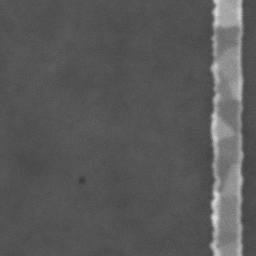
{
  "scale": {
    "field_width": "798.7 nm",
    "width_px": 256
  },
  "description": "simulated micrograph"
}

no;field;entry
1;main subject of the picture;one or a few lines or trenches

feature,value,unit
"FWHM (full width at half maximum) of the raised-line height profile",80.8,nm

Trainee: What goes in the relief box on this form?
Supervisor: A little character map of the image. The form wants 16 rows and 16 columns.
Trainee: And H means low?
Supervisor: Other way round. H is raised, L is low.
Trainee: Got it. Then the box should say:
LLLLLLLLLLLLLHHL
LLLLLLLLLLLLLHHL
LLLLLLLLLLLLLHHL
LLLLLLLLLLLLLHHL
LLLLLLLLLLLLLHHL
LLLLLLLLLLLLLHHL
LLLLLLLLLLLLLHHL
LLLLLLLLLLLLLHHL
LLLLLLLLLLLLLHHL
LLLLLLLLLLLLLHHL
LLLLLLLLLLLLLHHL
LLLLLLLLLLLLLLHL
LLLLLLLLLLLLLHHL
LLLLLLLLLLLLLHHL
LLLLLLLLLLLLLHHL
LLLLLLLLLLLLLHHL